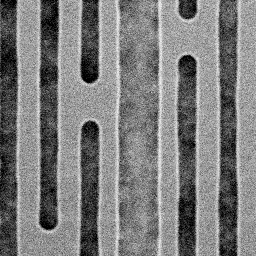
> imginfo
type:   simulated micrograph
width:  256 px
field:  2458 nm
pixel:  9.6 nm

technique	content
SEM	groups of lines, slits or small figures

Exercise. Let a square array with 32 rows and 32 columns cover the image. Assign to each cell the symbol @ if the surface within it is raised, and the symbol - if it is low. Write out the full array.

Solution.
--@@@--@@@--@@@-----@@---@@---@@
--@@@---@@--@@@-----@@---@@---@@
--@@@---@@--@@@-----@@@@@@@---@@
--@@@---@@---@@-----@@@@@@@---@@
--@@@--@@@---@@-----@@@@@@@---@@
--@@@--@@@---@@-----@@@@@@@---@@
--@@@--@@@---@@-----@@@@@@@---@@
--@@@--@@@--@@@-----@@--@@@---@@
--@@@--@@@--@@@-----@@---@@---@@
--@@@--@@@--@@@-----@@---@@---@@
--@@@--@@@@@@@@-----@@---@@---@@
--@@@--@@@@@@@@-----@@---@@---@@
--@@@--@@@@@@@@-----@@---@@---@@
--@@@--@@@@@@@@-----@@---@@---@@
--@@@--@@@@@@@@-----@@---@@---@@
--@@@--@@@--@@@-----@@---@@---@@
--@@@--@@@--@@@-----@@---@@---@@
--@@@--@@@---@@-----@@---@@---@@
--@@@--@@@---@@-----@@---@@---@@
--@@@--@@@---@@-----@@---@@---@@
--@@@--@@@---@@-----@@---@@---@@
--@@@--@@@---@@-----@@---@@---@@
--@@@--@@@--@@@-----@@---@@---@@
--@@@--@@@--@@@-----@@---@@---@@
--@@@--@@@--@@@-----@@---@@---@@
--@@@--@@@--@@@-----@@---@@---@@
--@@@--@@@--@@@-----@@---@@---@@
--@@@--@@@--@@@-----@@---@@---@@
--@@@--@@@--@@@-----@@---@@---@@
--@@@@@@@@--@@@-----@@---@@---@@
--@@@@@@@@--@@@-----@@---@@---@@
--@@@@@@@@--@@@-----@@---@@---@@